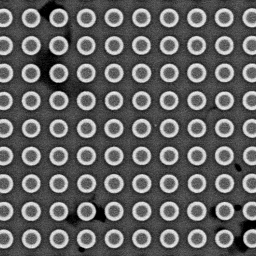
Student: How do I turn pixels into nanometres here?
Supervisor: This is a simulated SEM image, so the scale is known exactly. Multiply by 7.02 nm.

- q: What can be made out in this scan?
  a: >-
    an array of small figures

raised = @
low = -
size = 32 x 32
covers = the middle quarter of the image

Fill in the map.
----@@@----@@@----@@@----@@@----
@--@@@@@--@@@@@--@@@@@--@@@@---@
@--@@@@@--@@@@@--@@@@@--@@@@@--@
@---@@@----@@@---@@@@---@@@@---@
-----@------@------@------------
--------------------------------
--------------------------------
----@@@----@@@----@@@----@@@----
@--@@@@@--@@@@@--@@@@---@@@@---@
@--@@@@@--@@@@@--@@@@---@@@@---@
@---@@@----@@@----@@@---@@@@---@
--------------------------------
--------------------------------
--------------------------------
----@@@----@@@----@@@----@@@----
@--@@@@@--@@@@@--@@@@@--@@@@@--@
@--@@@@@--@@@@@--@@@@@--@@@@@--@
----@@@----@@@----@@@----@@@---@
--------------------------------
--------------------------------
--------------------------------
----@@@----@@@----@@@---@@@@---@
@--@@@@@--@@@@@--@@@@@--@@@@---@
@--@@@@@--@@@@@--@@@@@--@@@@---@
----@@@----@@@----@@@----@@@----
--------------------------------
--------------------------------
--------------------------------
----@@@----@@@----@@@---@@@@---@
@--@@@@@--@@@@@--@@@@@--@@@@---@
@--@@@@@--@@@@@--@@@@@--@@@@---@
----@@@----@@@----@@@----@@@----